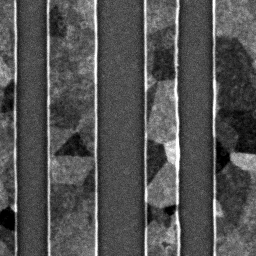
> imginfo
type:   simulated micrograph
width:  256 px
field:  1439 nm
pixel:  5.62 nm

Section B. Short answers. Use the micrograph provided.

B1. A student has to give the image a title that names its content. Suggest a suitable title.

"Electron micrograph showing one or a few lines or trenches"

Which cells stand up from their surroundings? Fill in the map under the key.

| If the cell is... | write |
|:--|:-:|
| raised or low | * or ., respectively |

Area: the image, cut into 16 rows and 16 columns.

*..***...**..***
*..***...**..***
*..***...**..***
*..***...**..***
*..***...**..***
*..***...**..***
*..***...**..***
*..***...**..***
*..***...**..***
*..***...**..***
*..***...**..***
*..***...**..***
*..***...**..***
*..***...**..***
*..***...**..***
*..***...**..***